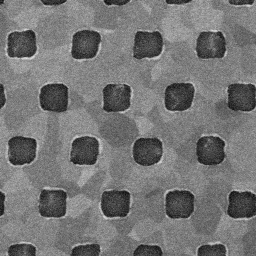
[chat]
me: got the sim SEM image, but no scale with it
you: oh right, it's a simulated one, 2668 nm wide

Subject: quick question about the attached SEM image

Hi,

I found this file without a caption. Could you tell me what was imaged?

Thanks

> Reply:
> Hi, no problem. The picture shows a regular array of holes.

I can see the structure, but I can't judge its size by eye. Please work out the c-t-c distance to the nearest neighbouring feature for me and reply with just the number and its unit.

640 nanometers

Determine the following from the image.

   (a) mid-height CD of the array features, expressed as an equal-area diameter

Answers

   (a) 324 nm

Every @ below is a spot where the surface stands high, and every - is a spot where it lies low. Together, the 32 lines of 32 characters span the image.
@@@@@---@@@@@---@@@@@--@@@@@@--@
@@@@@@@@@@@@@@@@@@@@@@@@@@@@@@@@
@@@@@@@@@@@@@@@@@@@@@@@@@@@@@@@@
@@@@@@@@@@@@@@@@@@@@@@@@@@@@@@@@
@---@@@@@----@@@@---@@@@@---@@@@
@----@@@@---@@@@@---@@@@----@@@@
@----@@@@---@@@@@---@@@@----@@@@
@@@@@@@@@@@@@@@@@@@@@@@@@@@@@@@@
@@@@@@@@@@@@@@@@@@@@@@@@@@@@@@@@
@@@@@@@@@@@@@@@@@@@@@@@@@@@@@@@@
@@@@@@--@@@@@@-@@@@@@@--@@@@@-@@
-@@@@----@@@@---@@@@@---@@@@----
-@@@@----@@@@---@@@@@---@@@@----
@@@@@---@@@@@---@@@@@---@@@@@---
@@@@@@@@@@@@@@@@@@@@@@@@@@@@@@@@
@@@@@@@@@@@@@@@@@@@@@@@@@@@@@@@@
@@@@@@@@@@@@@@@@@@@@@@@@@@@@@@@@
@---@@@@@---@@@@@---@@@@@---@@@@
@----@@@@---@@@@@---@@@@@---@@@@
@----@@@@---@@@@@---@@@@@---@@@@
@--@@@@@@---@@@@@--@@@@@@--@@@@@
@@@@@@@@@@@@@@@@@@@@@@@@@@@@@@@@
@@@@@@@@@@@@@@@@@@@@@@@@@@@@@@@@
@@@@@@@@@@@@@@@@@@@@@@@@@@@@@@@@
-@@@@---@@@@@---@@@@@---@@@@@---
-@@@@---@@@@@---@@@@@---@@@@@---
@@@@@---@@@@@---@@@@@---@@@@----
@@@@@@@@@@@@@@@@@@@@@@@@@@@@@@@@
@@@@@@@@@@@@@@@@@@@@@@@@@@@@@@@@
@@@@@@@@@@@@@@@@@@@@@@@@@@@@@@@@
@@--@@@@@@@-@@@@@@@@@@@@@@@-@@@@
@----@@@@----@@@@---@@@@@---@@@@